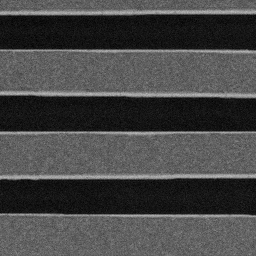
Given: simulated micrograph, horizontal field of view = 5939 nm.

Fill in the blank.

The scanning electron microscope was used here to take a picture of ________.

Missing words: lines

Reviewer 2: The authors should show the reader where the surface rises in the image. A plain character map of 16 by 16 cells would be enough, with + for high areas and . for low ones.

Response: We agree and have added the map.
++++++++++++++++
................
................
++++++++++++++++
++++++++++++++++
++++++++++++++++
................
................
++++++++++++++++
++++++++++++++++
++++++++++++++++
................
................
++++++++++++++++
++++++++++++++++
++++++++++++++++